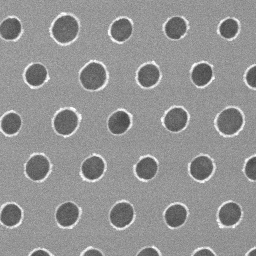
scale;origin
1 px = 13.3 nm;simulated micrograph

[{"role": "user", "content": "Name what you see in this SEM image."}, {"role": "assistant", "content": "a regular array of holes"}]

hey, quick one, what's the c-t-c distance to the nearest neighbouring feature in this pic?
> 706 nanometres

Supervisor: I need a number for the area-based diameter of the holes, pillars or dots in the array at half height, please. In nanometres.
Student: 311